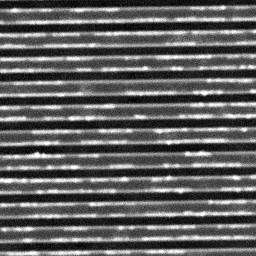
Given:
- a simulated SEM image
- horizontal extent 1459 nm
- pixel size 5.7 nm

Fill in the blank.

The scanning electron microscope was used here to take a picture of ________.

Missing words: parallel lines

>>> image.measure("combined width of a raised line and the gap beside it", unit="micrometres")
0.138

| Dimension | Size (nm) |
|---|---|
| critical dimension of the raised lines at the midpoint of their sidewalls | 82.6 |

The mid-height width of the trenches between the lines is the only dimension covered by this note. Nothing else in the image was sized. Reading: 0.057 micrometres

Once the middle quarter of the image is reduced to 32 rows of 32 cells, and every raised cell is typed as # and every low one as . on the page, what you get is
################################
######################..........
................................
................................
....############################
################################
################################
###############.########..##....
................................
................................
#####....#######################
################################
################################
########################........
................................
................................
.........########.....##########
################################
################################
################################
................................
................................
...............#################
################################
################################
###############################.
................................
................................
..............##........########
################################
################################
################################